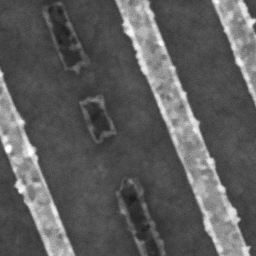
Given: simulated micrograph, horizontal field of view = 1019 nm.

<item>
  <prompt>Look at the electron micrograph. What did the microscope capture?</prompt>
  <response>one or a few lines or trenches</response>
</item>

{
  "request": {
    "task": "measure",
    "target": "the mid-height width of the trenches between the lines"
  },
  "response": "0.237 microns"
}